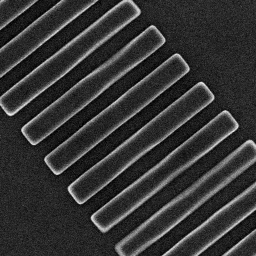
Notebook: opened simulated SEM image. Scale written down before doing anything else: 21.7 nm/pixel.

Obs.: groups of lines, slits or small figures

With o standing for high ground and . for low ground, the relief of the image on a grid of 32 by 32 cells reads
oooo...ooooo...oo...............
ooo...oooo....ooo...............
oo...oooo...oooo................
...ooooo...oooo.................
..ooooo...oooo...ooo............
.oooo....oooo...oooo............
oooo...oooo....oooo.............
ooo...oooo....oooo...oo.........
oo...oooo...oooo....oooo........
...ooooo...oooo...ooooo.........
..ooooo...oooo...ooooo..........
.oooo...ooooo...oooo...ooo......
oooo...ooooo...oooo...ooooo.....
ooo...oooo...ooooo...oooo.......
.....oooo...ooooo...oooo...oo...
...ooooo...oooo...ooooo...oooo..
...oooo...oooo...ooooo...oooo...
....o...ooooo...oooo...ooooo....
.......ooooo...oooo...oooo....oo
......oooo...ooooo...oooo....ooo
......ooo...oooo....oooo....ooo.
.......o...oooo....ooo....oooo..
..........oooo...oooo....oooo...
.........oooo...oooo....oooo...o
.........ooo...oooo....ooo....oo
.............ooooo...oooo....ooo
............oooo....oooo...ooooo
............ooo....oooo...oooo..
............oo...oooo....oooo...
................oooo...ooooo...o
...............oooo...oooo....oo
...............oo....oooo...oooo